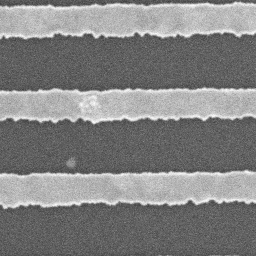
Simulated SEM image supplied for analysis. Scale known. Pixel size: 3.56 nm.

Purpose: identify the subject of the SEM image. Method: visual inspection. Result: lines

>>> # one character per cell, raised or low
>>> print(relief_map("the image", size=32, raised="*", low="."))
..............*......*...*...***
********************************
********************************
********************************
******........**....**..........
................................
................................
................................
................................
................................
................................
**.*******.*.*******************
********************************
********************************
********************************
................................
................................
................................
................................
................................
................................
.............................***
********************************
********************************
********************************
**********...*....**.**.........
................................
................................
................................
................................
................................
................................